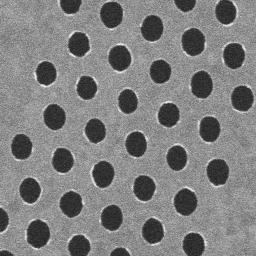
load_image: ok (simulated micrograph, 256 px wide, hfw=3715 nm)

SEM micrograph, a regular array of holes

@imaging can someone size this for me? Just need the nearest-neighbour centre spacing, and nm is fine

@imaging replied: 625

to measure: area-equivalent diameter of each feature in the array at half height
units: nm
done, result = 356